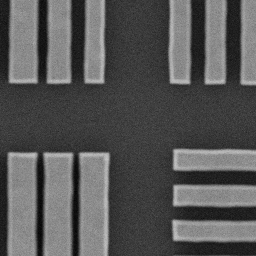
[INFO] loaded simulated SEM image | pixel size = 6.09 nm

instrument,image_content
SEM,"groups of lines, slits or small figures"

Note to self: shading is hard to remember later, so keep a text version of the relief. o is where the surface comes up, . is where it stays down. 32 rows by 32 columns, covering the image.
..ooo.ooo..oo........ooo..oo..oo
..oo..ooo..oo........ooo..oo..oo
.ooo..ooo..oo........ooo..oo..oo
.ooo..ooo..oo........ooo..oo..oo
.ooo..ooo..oo........ooo..oo..oo
.ooo..ooo..oo........ooo..oo..oo
.ooo..ooo..oo........ooo..oo..oo
.oooo.ooo..oo........ooo..oo..oo
.ooo..ooo..oo........ooo..oo..oo
.ooo..ooo..oo........ooo..oo..oo
................................
................................
................................
................................
................................
................................
................................
................................
................................
.ooo..ooo.ooo.........oooooooooo
.ooo..ooo.ooo.........oooooooooo
.ooo..ooo.ooo...................
.ooo..ooo.ooo...................
.ooo..ooo.ooo.........oooooooooo
.ooo..ooo.ooo.........oooooooooo
.ooo..ooo.ooo.........oooooooooo
.ooo..ooo.ooo...................
.ooo..ooo.ooo...................
.ooo..ooo.ooo.........oooooooooo
.ooo..ooo.ooo.........oooooooooo
.ooo..ooo.ooo...................
.ooo..ooo.ooo...................